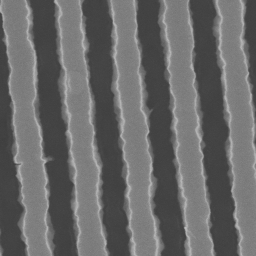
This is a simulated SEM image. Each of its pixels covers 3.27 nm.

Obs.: parallel lines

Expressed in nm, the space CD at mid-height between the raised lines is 85.1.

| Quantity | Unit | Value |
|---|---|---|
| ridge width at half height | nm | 88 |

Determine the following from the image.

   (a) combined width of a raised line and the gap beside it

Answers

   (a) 174 nanometres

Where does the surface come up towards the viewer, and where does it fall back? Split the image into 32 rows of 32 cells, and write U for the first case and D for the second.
UUUDDDDUUUDDDDUUUDDDUUUUDDDUUUUD
UUUUDDDUUUDDDDUUUDDDUUUUDDDUUUUD
UUUUDDDUUUDDDDUUUDDDUUUUDDDUUUUD
UUUUDDDUUUUDDDUUUDDDUUUUDDDUUUUD
DUUUDDDUUUUDDDUUUDDDUUUUDDDUUUDD
DUUUDDDDUUUDDDUUUDDDDUUUDDDUUUUD
DUUUDDDUUUUDDDUUUDDDDUUUDDDUUUUD
DUUUUDDUUUUDDDUUUUDDDUUUDDDUUUUD
DUUUUDDDUUUDDDUUUDDDDUUUDDDDUUUD
DUUUUDDDUUUDDDUUUUDDDUUUDDDDUUUD
DUUUUDDDUUUDDDUUUUDDDUUUDDDDUUUD
DUUUUDDDUUUDDDUUUUDDDUUUUDDDUUUD
DDUUUDDDUUUUDDDUUUDDDDUUUDDDUUUD
DDUUDDDDUUUUDDDUUUDDDDUUUDDDUUUU
DDUUDDDDUUUUDDDUUUDDDDUUUDDDUUUU
DDUUUDDDUUUUDDDUUUDDDDUUUDDDDUUU
DDUUUDDDUUUUDDDUUUUDDDUUUDDDDUUU
DDUUUDDDDUUUDDDUUUUDDDUUUDDDDUUU
DDUUUDDDDUUUDDDUUUUDDDUUUDDDDUUU
DDUUUDDDDUUUDDDUUUUDDDUUUDDDDUUU
DDUUUUDDDUUUUDDDUUUDDDUUUDDDDUUU
DDUUUUDDDUUUUDDDUUUDDDUUUDDDDUUU
DDUUUUDDDUUUUDDDUUUDDDUUUUDDDUUU
DDDUUUDDDUUUDDDDUUUDDDUUUUDDDUUU
DDDUUUDDDUUUUDDDUUUDDDDUUUDDDUUU
DDDUUUDDDUUUUDDDUUUDDDDUUUDDDUUU
DDDUUUDDDUUUUDDDUUUDDDDUUUDDDUUU
DDDUUUDDDUUUUDDDUUUDDDDUUUDDDUUU
DDDUUUDDDDUUUDDDUUUUDDDUUUDDDUUU
DDDUUUDDDDUUUDDDUUUUDDDUUUDDDDUU
DDDUUUDDDDUUUDDDUUUUDDDUUUUDDDUU
DDDUUUUDDDUUUDDDUUUUDDDUUUUDDDUU